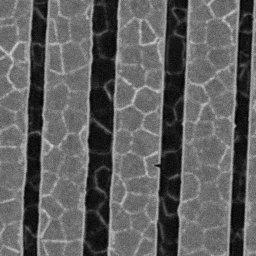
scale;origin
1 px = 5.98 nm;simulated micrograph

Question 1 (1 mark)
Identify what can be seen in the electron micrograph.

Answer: one or a few lines or trenches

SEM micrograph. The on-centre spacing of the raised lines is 0.427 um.